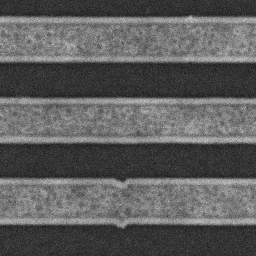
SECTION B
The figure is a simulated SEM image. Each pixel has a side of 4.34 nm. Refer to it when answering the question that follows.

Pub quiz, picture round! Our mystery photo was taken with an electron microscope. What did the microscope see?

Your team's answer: one or a few lines or trenches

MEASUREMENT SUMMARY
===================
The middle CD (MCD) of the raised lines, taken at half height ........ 168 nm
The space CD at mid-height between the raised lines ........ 183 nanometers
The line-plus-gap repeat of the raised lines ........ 0.351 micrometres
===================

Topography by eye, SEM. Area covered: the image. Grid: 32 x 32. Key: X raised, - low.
--------------------------------
--------------------------------
-----------------------X--------
XXXXXXXXXXXXXXXXXXXXXXXXXXXXXXXX
XXXXXXXXXXXXXXXXXXXXXXXXXXXXXXXX
XXXXXXXXXXXXXXXXXXXXXXXXXXXXXXXX
XXXXXXXXXXXXXXXXXXXXXXXXXXXXXXXX
--------------------------------
--------------------------------
--------------------------------
--------------------------------
--------------------------------
--------------------------------
XXXXXXXXXXXXXXXXXXXXXXXXXXXXXXXX
XXXXXXXXXXXXXXXXXXXXXXXXXXXXXXXX
XXXXXXXXXXXXXXXXXXXXXXXXXXXXXXXX
XXXXXXXXXXXXXXXXXXXXXXXXXXXXXXXX
--------------------------------
--------------------------------
--------------------------------
--------------------------------
--------------------------------
--------------------------------
XXXXXXXXXXXXXXXXXXXXXXXXXXXXXXXX
XXXXXXXXXXXXXXXXXXXXXXXXXXXXXXXX
XXXXXXXXXXXXXXXXXXXXXXXXXXXXXXXX
XXXXXXXXXXXXXXXXXXXXXXXXXXXXXXXX
XXXXXXXXXXXXXXXXXX-XXXXXXXXXXXXX
--------------------------------
--------------------------------
--------------------------------
--------------------------------